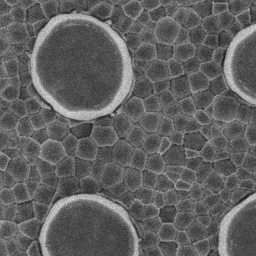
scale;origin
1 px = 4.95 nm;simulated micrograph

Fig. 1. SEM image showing raised bodies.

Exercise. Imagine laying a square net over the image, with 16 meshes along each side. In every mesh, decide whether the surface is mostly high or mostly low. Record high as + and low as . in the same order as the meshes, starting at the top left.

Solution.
................
...+++..........
...++++........+
..++++++......++
..++++++......++
..++++++.......+
...++++.........
................
................
................
................
................
....++.........+
...+++++......++
...+++++......++
...++++++.....++